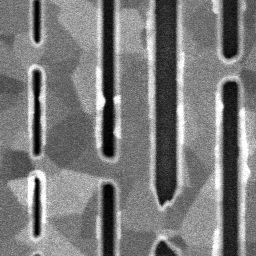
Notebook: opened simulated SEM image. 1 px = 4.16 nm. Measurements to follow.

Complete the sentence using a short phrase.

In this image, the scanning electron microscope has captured one or a few lines or trenches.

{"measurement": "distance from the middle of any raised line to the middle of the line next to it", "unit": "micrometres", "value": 0.266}